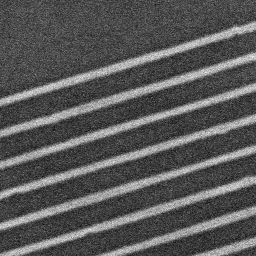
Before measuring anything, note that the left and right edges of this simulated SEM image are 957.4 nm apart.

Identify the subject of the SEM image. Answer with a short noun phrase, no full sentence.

parallel lines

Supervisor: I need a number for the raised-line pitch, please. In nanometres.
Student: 111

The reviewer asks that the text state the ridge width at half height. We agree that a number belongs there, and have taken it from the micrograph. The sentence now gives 22.4 nm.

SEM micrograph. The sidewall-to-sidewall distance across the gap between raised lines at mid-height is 0.0886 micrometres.